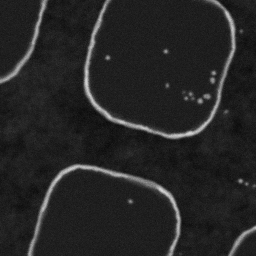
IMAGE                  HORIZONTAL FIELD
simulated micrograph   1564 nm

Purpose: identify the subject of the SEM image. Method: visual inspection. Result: raised bodies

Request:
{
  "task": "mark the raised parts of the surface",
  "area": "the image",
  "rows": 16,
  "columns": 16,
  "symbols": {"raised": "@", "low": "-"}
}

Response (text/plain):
@@@---@@@@@@@@--
@@----@@@@@@@@@-
@@----@@@@@@@@@-
@@----@@@@@@@@--
@----@@@@@@@@@--
-----@@@@@@@@@--
------@@@@@@@@--
-------@@@@@@---
----------@-----
----------------
----@@----------
---@@@@@@-------
---@@@@@@@@-----
--@@@@@@@@@-----
--@@@@@@@@@----@
--@@@@@@@@@----@